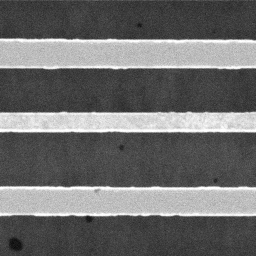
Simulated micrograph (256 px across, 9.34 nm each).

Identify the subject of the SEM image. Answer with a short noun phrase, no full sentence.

lines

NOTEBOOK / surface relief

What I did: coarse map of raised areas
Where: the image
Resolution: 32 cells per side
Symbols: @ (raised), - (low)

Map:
--------------------------------
--------------------------------
--------------------------------
--------------------------------
--------------------------------
@@@@@@@@@@@@@@@@@@@@@@@@@@@@@@@@
@@@@@@@@@@@@@@@@@@@@@@@@@@@@@@@@
@@@@@@@@@@@@@@@@@@@@@@@@@@@@@@@@
-----@@@------@@-----------@@@--
--------------------------------
--------------------------------
--------------------------------
--------------------------------
--------------------------------
@@@@@@@@@@@@@@@@@@@@@@@@@@@@@@@@
@@@@@@@@@@@@@@@@@@@@@@@@@@@@@@@@
--------------------------------
--------------------------------
--------------------------------
--------------------------------
--------------------------------
--------------------------------
--------------------------------
@@@@@@@-@@@@@------------@@-----
@@@@@@@@@@@@@@@@@@@@@@@@@@@@@@@@
@@@@@@@@@@@@@@@@@@@@@@@@@@@@@@@@
@@@@@@@@@@@@@@@@@@@@@@@@@@@@@@@@
--------------------------------
--------------------------------
--------------------------------
--------------------------------
--------------------------------